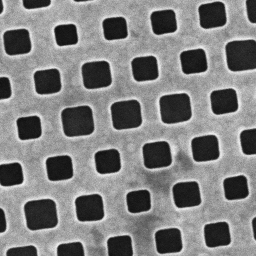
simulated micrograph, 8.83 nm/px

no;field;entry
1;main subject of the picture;a regular array of holes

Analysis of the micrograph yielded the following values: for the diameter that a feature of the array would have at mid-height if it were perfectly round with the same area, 250 nm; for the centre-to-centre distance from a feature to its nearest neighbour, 49 pixels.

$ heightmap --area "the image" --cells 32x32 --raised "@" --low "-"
@@@---@@@@@@@@@@@@@@@@@@@---@@@-
@@@@@@@@@@@@@@@@@@@---@@@---@@@-
@@@@@@@@@@@@@---@@@---@@@---@@@-
@@@@@@@---@@@---@@@---@@@--@@@@@
----@@@---@@@---@@@@@@@@@@@@@@@@
----@@@--@@@@@@@@@@@@@@@@@@@----
@---@@@@@@@@@@@@@@@@@@@---@@----
@@@@@@@@@@@@@@@@@---@@@---@@----
@@@@@@@@@@----@@----@@@---@@@---
@@@@---@@@----@@@---@@@@@@@@@@@@
-@@@----@@----@@@@@@@@@@@@@@@@@@
-@@@@--@@@@@@@@@@@@@@@@@@@@--@@@
@@@@@@@@@@@@@@@@-@@@----@@----@@
@@@@@@@@---@@@----@@----@@----@@
@@@@-@@@----@@----@@----@@@@@@@@
@@---@@@----@@----@@@@@@@@@@@@@@
@@---@@@----@@@@@@@@@@@@@@@@@@--
@@@@@@@@@@@@@@@@@@@@@@@@---@@@--
@@@@@@@@@@@@@@@@@@---@@@---@@@--
@@@@@@@--@@@---@@@---@@@---@@@@@
@-@@@@---@@@---@@@---@@@@@@@@@@@
---@@@---@@@---@@@@@@@@@@@@@@@@@
---@@@--@@@@@@@@@@@@@@@@@@@@---@
@@@@@@@@@@@@@@@@@@@@@@---@@@---@
@@@@@@@@@@--@@@@---@@@---@@@---@
@@@----@@----@@@---@@@---@@@@@@@
-@@----@@@---@@@--@@@@@@@@@@@@@@
-@@----@@@--@@@@@@@@@@@@@@@@@@@@
-@@@---@@@@@@@@@@@@@@-@@@@---@@@
@@@@@@@@@@@@@@@-@@@----@@@---@@@
@@@@@@@@--@@@----@@----@@@---@@@
@----@@----@@----@@@--@@@@@@@@@@